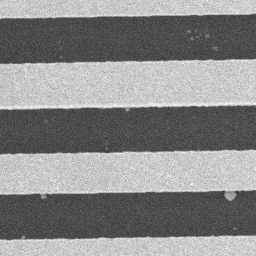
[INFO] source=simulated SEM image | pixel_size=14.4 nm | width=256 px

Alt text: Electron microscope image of lines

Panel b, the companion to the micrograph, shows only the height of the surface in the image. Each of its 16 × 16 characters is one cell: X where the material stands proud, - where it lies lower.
XXXXXXXXXXXXXXXX
----------------
----------------
----------------
XXXXXXXXXXXXXXXX
XXXXXXXXXXXXXXXX
XXXXXXXXXXXXXXXX
----------------
----------------
-----------XXXXX
XXXXXXXXXXXXXXXX
XXXXXXXXXXXXXXXX
----------------
----------------
----------------
XXXXXXXXXXXXXXXX